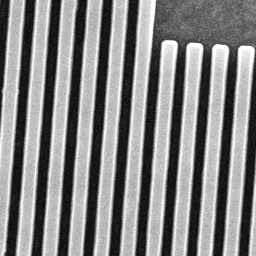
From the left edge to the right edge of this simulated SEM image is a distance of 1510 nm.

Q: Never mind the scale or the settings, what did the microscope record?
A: parallel lines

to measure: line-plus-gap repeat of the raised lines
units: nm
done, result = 152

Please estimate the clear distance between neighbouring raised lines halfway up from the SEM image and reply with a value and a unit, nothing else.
11.6 px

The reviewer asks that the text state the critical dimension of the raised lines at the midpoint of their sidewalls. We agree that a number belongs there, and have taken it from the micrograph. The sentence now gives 83.8 nm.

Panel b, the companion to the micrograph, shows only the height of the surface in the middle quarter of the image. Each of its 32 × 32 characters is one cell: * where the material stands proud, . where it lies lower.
**...***...****...***...****...*
**...***...****...***...***....*
*....***...***....***...***....*
**..****...***....***...***...**
**..****...***...****...***...**
*...****...***...****...***...**
*...****...***...****...***...**
*...****...***...****...***...**
*...***....***...***....***...**
*...***....***...***...****...**
*...***...****...***...****...**
*...***...****...***...****...**
*...***...****...***...****...**
*...***...****...***...****...**
*...***...****...***...***....**
....***...***....***...***....**
...****...***....***...***...***
...****...***....***...***...***
....***...***...****...***...***
...****...***...****...***...***
...****...***...****...***...***
...***....***...***....***...***
...***....***...***...****...***
...***...****...***...****...***
...***...****...***...****...***
...***...****...***...****...***
...***...****...***...****...***
...***...****...***...***....***
...***...***....***...***....***
..****...***...****...***...****
..****...***....***...***...****
...***...***...****...***...****